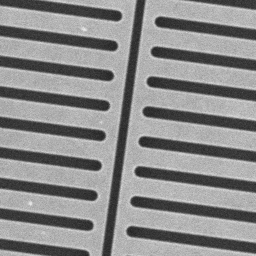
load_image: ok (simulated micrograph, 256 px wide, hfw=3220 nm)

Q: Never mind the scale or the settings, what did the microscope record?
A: groups of lines, slits or small figures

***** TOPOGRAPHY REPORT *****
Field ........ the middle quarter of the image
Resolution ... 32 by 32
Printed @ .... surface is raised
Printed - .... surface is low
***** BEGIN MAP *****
-----@@@@@@@@@@@--@@@@@@@@@@@@@@
-----------@@@@@--@@@@@@@@@@@@@@
-------------@@---@@@@@@@@@@@@@@
@@@@---------@@---@@@-----@@@@@@
@@@@@@@@@@@@@@@---@@------------
@@@@@@@@@@@@@@@---@@@-----------
@@@@@@@@@@@@@@@--@@@@@@@@-------
@@@@@@@@@@@@@@@--@@@@@@@@@@@@@@@
-------@@@@@@@@--@@@@@@@@@@@@@@@
-----------@@@---@@@@@@@@@@@@@@@
------------@@---@@@@@@@@@@@@@@@
@@@@@@-----@@@---@@@--------@@@@
@@@@@@@@@@@@@@---@@@------------
@@@@@@@@@@@@@@--@@@@@@----------
@@@@@@@@@@@@@@--@@@@@@@@@@@@@---
--@@@@@@@@@@@@--@@@@@@@@@@@@@@@@
---------@@@@@--@@@@@@@@@@@@@@@@
----------@@@@--@@@@@@@@@@@@@@@@
@---------@@@---@@@-----@@@@@@@@
@@@@@@@@@@@@@---@@@-------------
@@@@@@@@@@@@@--@@@@-------------
@@@@@@@@@@@@@--@@@@@@@@@--------
@@@@@@@@@@@@@--@@@@@@@@@@@@@@@@@
-----@@@@@@@@--@@@@@@@@@@@@@@@@@
---------@@@@--@@@@@@@@@@@@@@@@@
---------@@@---@@@@@@@@@@@@@@@@@
@@@@@@---@@@---@@@----------@@@@
@@@@@@@@@@@@--@@@@--------------
@@@@@@@@@@@@--@@@@@@------------
@@@@@@@@@@@@--@@@@@@@@@@@@@-----
@@@@@@@@@@@@--@@@@@@@@@@@@@@@@@@
-------@@@@@--@@@@@@@@@@@@@@@@@@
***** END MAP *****